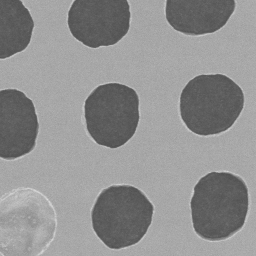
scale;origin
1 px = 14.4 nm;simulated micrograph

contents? holes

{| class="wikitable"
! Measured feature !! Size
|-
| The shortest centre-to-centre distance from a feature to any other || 1420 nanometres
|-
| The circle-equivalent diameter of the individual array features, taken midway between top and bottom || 900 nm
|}